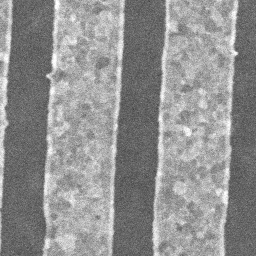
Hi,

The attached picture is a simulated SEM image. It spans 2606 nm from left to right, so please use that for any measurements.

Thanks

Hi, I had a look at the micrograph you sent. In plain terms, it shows one or a few lines or trenches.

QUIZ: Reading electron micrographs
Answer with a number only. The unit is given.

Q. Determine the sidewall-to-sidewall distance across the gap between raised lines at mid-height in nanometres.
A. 461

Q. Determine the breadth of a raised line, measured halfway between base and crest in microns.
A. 0.682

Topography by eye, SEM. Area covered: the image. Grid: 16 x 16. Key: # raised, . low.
#...####..#####.
#..#####..#####.
#..#####..#####.
...#####..#####.
...####...####..
...####...####..
...####...####..
...####...####..
...####...####..
...####...####..
...####...####..
...####...####..
...####...####..
...####...####..
...####...####..
...####...####..